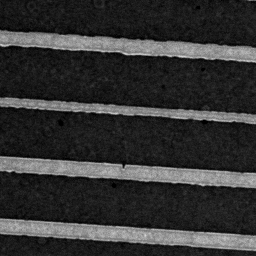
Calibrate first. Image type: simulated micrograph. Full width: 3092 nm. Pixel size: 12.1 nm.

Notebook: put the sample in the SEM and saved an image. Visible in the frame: one or a few lines or trenches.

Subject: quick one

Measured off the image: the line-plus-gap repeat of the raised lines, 62.7 pixels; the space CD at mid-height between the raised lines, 609 nanometres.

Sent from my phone